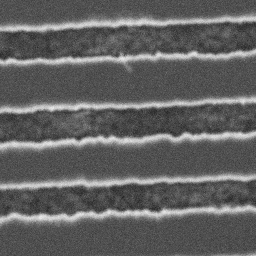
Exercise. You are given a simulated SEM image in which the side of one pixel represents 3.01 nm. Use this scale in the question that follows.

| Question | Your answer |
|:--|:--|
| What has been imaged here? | lines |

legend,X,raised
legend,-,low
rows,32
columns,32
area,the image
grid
XXXXXXXXXXXXXXXXXXXXXXXXXXXXXXXX
XXXXXXXXXXXXXXXXXXXXXXXXXXXXXXXX
XXXXXXXXXXXXXXXXXXXXXXXXXXXXXXXX
XXXXXXXX------------------------
--------------------------------
--------------------------------
-------------------------------X
-X--XX-XXXXXXXXXXXXXXXXXXXXXXXXX
XXXXXXXXXXXXXXXXXXXXXXXXXXXXXXXX
XXXXXXXXXXXXXXXXXXXXXXXXXXXXXXXX
XXXXXXXXXXXXXXXXXXXXXXXXXXXXXXXX
XXXXXXXXXXXXXXXXXXXXXXXXXXXXXXXX
XXXXXXXXXXXXXXXXXXXXXXXXXXXXXXXX
XXXXXXXXXXXXX-XX-X--------------
--------------------------------
--------------------------------
--------------------------------
----------XXXXXXXXXXXXXXXXXXXXXX
XXXXXXXXXXXXXXXXXXXXXXXXXXXXXXXX
XXXXXXXXXXXXXXXXXXXXXXXXXXXXXXXX
XXXXXXXXXXXXXXXXXXXXXXXXXXXXXXXX
XXXXXXXXXXXXXXXXXXXXXXXXXXXXXXXX
XXXXXXXXXXXXXXXXXXXXXXXXXX----X-
X-X-----------------------------
--------------------------------
--------------------------------
-------------XX-XXX-XXXXXXXXXXXX
XXXXXXXXXXXXXXXXXXXXXXXXXXXXXXXX
XXXXXXXXXXXXXXXXXXXXXXXXXXXXXXXX
XXXXXXXXXXXXXXXXXXXXXXXXXXXXXXXX
XXXXXXXXXXXXXXXXXXXXXXXXXXXXXXXX
XXXXXXXXXXXXXXXXXXXXXXXXXXXXXXXX